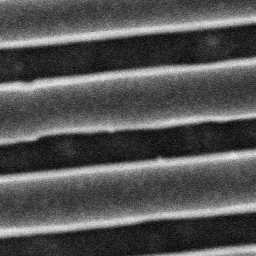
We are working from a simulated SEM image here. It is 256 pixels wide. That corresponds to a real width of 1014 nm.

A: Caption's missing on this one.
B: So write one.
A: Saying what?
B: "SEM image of one or a few lines or trenches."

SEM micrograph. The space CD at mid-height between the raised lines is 156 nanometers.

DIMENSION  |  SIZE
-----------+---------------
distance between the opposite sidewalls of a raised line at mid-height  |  220 nanometres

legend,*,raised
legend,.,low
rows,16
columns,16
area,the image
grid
****************
**************..
*****...........
................
.........*******
****************
****************
**************..
**..............
................
......**********
****************
****************
***********.....
**..............
................